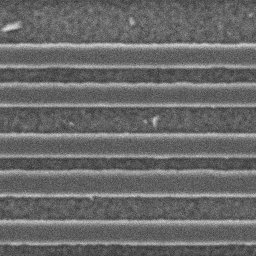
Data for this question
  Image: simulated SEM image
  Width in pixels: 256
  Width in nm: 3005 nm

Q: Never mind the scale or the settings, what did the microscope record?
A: lines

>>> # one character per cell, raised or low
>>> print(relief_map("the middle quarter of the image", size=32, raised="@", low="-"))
@@@@@@@@@@@@@@@@@@@@@@@@@@@@@@@@
--------------------------------
--------------------------------
--------------------------------
--------------------------------
@@@@@@@@@@@@@@@@@@@@@@@@@@@@@@@@
@@@@@@@@@@@@@@@@@@@@@@@@@@@@@@@@
@@@@@@@@@@@@@@@@@@@@@@@@@@@@@@@@
@@@@@@@@@@@@@@@@@@@@@@@@@@@@@@@@
@@@@@@@@@@@@@@@@@@@@@@@@@@@@@@@@
@@@@@@@@@@@@@@@@@@@@@@@@@@@@@@@@
--------------------------------
--------------------------------
--------------------------------
--------------------------------
--------------------------------
--------------------------------
--------------------------------
@@@@@@@@@@@@@@@@@@@@@@@@@@@@@@@@
@@@@@@@@@@@@@@@@@@@@@@@@@@@@@@@@
@@@@@@@@@@@@@@@@@@@@@@@@@@@@@@@@
@@@@@@@@@@@@@@@@@@@@@@@@@@@@@@@@
@@@@@@@@@@@@@@@@@@@@@@@@@@@@@@@@
--------------------------------
--------------------------------
--------------------------------
--------------------------------
@@@@@@@@@@@@@@@@@@@@@@@@@@@@@@@@
@@@@@@@@@@@@@@@@@@@@@@@@@@@@@@@@
@@@@@@@@@@@@@@@@@@@@@@@@@@@@@@@@
@@@@@@@@@@@@@@@@@@@@@@@@@@@@@@@@
@@@@@@@@@@@@@@@@@@@@@@@@@@@@@@@@